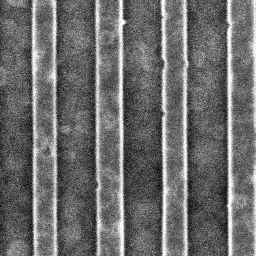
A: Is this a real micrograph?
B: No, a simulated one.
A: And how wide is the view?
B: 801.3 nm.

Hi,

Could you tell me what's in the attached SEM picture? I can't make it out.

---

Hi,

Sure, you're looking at one or a few lines or trenches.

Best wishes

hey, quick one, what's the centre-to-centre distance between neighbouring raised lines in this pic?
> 0.204 micrometres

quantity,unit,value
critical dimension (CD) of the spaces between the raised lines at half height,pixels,42.4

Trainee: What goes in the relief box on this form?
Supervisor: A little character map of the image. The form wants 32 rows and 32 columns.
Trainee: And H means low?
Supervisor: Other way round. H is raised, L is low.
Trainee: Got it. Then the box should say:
LLLLHHHLLLLLHHHLLLLLHHHLLLLLLHHH
LLLLHHHLLLLLHHHLLLLLHHHLLLLLLHHH
LLLLHHHLLLLLHHHLLLLLHHHLLLLLLHHH
LLLLHHHLLLLLHHHLLLLLHHHLLLLLLHHH
LLLLHHHLLLLLHHHLLLLLLHHLLLLLLHHH
LLLLHHHLLLLLHHHLLLLLLHHLLLLLLHHH
LLLLHHHLLLLLHHHLLLLLLHHLLLLLLHHH
LLLLHHHLLLLLHHHLLLLLLHHLLLLLLHHH
LLLLHHHLLLLLHHHLLLLLLHHLLLLLLHHH
LLLLHHHLLLLLHHHLLLLLLHHLLLLLLHHH
LLLLHHHLLLLLHHHLLLLLLHHLLLLLLHHH
LLLLHHHLLLLLHHHLLLLLLHHLLLLLLHHH
LLLLHHHLLLLLHHHLLLLLLHHLLLLLLHHH
LLLLHHHLLLLLHHHLLLLLLHHLLLLLLHHH
LLLLHHHLLLLLHHHLLLLLLHHLLLLLLHHH
LLLLHHHLLLLLHHHLLLLLLHHLLLLLLHHH
LLLLHHHLLLLLHHHLLLLLHHHLLLLLLHHH
LLLLHHHLLLLLHHHLLLLLHHHLLLLLLHHH
LLLLHHHLLLLLHHHLLLLLHHHLLLLLLHHH
LLLLHHHLLLLLHHHLLLLLHHHLLLLLLHHH
LLLLHHHLLLLLHHHLLLLLLHHLLLLLLHHH
LLLLHHHLLLLLHHHLLLLLLHHLLLLLLHHH
LLLLHHHLLLLLHHHLLLLLLHHLLLLLLHHH
LLLLHHHLLLLLHHHLLLLLLHHLLLLLLHHH
LLLLHHHLLLLLHHHLLLLLLHHLLLLLLHHH
LLLLHHHLLLLLHHHLLLLLLHHLLLLLLHHH
LLLLHHHLLLLLHHHLLLLLLHHLLLLLLHHH
LLLLHHHLLLLLHHHLLLLLLHHLLLLLLHHH
LLLLHHHLLLLLHHHLLLLLLHHLLLLLLHHH
LLLLHHHLLLLLHHHLLLLLLHHLLLLLLHHH
LLLLHHHLLLLLHHHLLLLLLHHLLLLLLHHH
LLLLHHHLLLLLHHHLLLLLLHHLLLLLLHHH